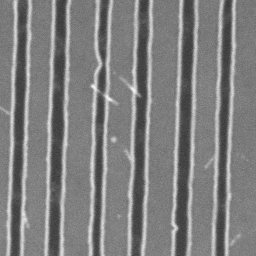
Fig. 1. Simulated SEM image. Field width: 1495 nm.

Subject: parallel lines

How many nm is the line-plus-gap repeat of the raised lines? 239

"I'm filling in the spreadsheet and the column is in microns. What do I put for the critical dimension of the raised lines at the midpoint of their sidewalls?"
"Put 0.0854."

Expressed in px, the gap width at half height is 26.5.